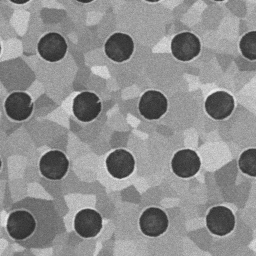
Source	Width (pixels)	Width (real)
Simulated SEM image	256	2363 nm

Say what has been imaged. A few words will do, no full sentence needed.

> a regular array of holes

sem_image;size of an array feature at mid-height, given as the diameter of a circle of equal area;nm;279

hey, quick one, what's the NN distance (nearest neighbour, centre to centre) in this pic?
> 612 nanometers